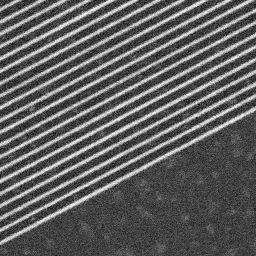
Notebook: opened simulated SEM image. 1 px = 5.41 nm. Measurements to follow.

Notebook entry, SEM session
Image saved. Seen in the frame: parallel lines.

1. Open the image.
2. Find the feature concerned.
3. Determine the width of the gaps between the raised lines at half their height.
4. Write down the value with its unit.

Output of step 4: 46.7 nanometres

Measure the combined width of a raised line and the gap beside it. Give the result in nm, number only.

58.8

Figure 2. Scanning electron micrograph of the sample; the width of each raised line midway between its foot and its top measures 2.53 pixels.